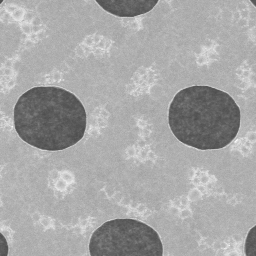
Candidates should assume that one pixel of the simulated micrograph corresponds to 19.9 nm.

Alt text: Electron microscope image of holes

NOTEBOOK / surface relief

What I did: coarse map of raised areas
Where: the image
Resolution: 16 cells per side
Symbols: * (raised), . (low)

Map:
******...*******
****************
****************
****************
****************
**..********.***
*....******....*
*....******....*
*....******....*
****************
****************
****************
****************
****************
******....******
******....*****.